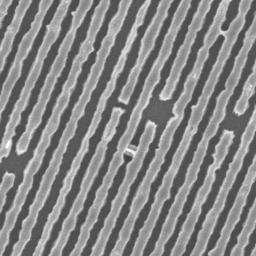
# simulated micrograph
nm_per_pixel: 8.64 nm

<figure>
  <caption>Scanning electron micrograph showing parallel lines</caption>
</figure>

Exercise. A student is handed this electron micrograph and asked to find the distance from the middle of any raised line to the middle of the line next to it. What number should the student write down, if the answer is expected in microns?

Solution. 0.159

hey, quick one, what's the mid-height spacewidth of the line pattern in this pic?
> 72.3 nanometres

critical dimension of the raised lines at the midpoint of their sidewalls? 87.2 nanometres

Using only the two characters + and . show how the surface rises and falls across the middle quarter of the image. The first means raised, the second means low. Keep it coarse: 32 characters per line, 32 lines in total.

..++...+++...++...+...+++..+++..
..++...+++..+++..++...++...++...
.+++..+++...++..+++..+++..+++...
.++...+++...+...++...+++..+++..+
+++...++...++...++..++++..++..++
+++..+++...++..+++..+++..+++..++
++...++...++..+++...++...++...++
++..+++...++..+++..+++..+++..+++
+...+++..++...++...++...++...+++
+...++...+.....+...++.......+++.
+..++...++........+++.......+++.
..+++...++..+++..+++.......+++..
..+++...+...++...++.........++..
..++...++...++...++........+++..
.++....++..+++..+++.......+++..+
.++...++...++...++...++...+++..+
+++...++..+++...++..+++..+++..++
++....+...+++..++...++...++...++
++...+....++..+++..+++..+++...++
+....+...++...++...+++..+++..++.
+...++..+++..+++++.++...+++..++.
....++..++...++++++++..+++..+++.
...++...++...++.++++...++...++..
...++..+++..+++..+++...++..+++..
..++...+++..+++.++++..+++..++...
..++..+++..+++..+++..+++...++..+
..+...++...++...+++..+++..++...+
.++...++...++..+++...++..+++...+
++...+++..++...+++..+++..++....+
++...++...++...++..+++...++...++
++..+++..+++..++...+++..+++...++
+...++..+++...++...++..+++...++.